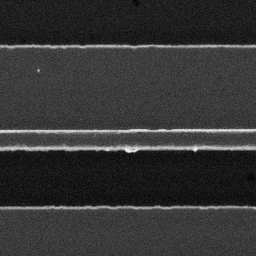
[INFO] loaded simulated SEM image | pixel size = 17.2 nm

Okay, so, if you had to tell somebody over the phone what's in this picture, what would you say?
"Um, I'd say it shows lines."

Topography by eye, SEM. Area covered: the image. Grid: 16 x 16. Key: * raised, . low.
................
................
................
****************
****************
****************
****************
****************
****************
................
................
................
................
****************
****************
****************